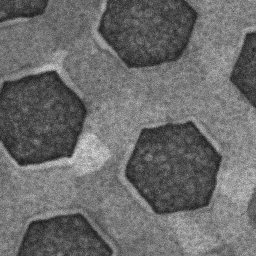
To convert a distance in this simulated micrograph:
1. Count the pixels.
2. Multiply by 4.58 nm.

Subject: holes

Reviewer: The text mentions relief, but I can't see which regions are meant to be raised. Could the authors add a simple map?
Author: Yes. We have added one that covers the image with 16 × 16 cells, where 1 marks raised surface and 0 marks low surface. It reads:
0001111000001111
1111110000001111
1111110000001110
1111111000011110
1111111111111100
0000111111111110
0000011111111111
0000011111101111
0000011110000111
0000011100000011
1111111100000011
1111111100000011
1111111110000111
1110011111111111
1100001111111111
1000000111111111